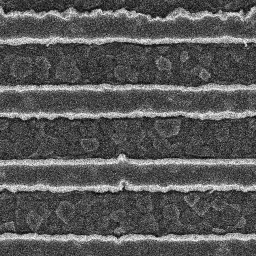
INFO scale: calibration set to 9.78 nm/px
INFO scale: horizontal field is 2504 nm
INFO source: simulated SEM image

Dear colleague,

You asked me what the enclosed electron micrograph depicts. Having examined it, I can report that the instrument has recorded one or a few lines or trenches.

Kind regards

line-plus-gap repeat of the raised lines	722	nm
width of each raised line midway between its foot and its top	0.266	micrometres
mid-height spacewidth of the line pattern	456	nanometres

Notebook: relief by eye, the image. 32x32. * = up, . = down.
................................
......*.....*..*...............*
********************************
********************************
********************************
................................
................................
................................
................................
................................
................................
********************************
********************************
********************************
..**....**.*...*........****....
................................
................................
................................
................................
................................
********************************
********************************
********************************
.*.************.***********...**
................................
................................
................................
................................
................................
.............................*..
********************************
********************************